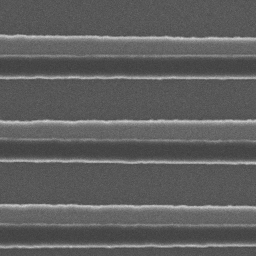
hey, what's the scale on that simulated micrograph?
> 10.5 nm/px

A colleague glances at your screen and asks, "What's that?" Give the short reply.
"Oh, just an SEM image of lines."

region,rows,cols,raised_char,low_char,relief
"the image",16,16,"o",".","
................
................
oooooooooooooooo
oooooooooooooooo
oooooooooooooooo
................
................
................
oooooooooooooooo
oooooooooooooooo
................
................
................
oooooooooooooooo
oooooooooooooooo
................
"